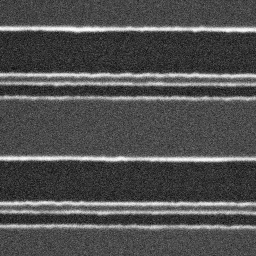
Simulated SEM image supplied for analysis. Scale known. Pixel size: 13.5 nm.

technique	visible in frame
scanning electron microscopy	lines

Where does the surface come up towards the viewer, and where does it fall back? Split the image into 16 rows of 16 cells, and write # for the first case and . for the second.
################
################
................
................
................
################
################
################
################
################
................
................
................
################
################
################